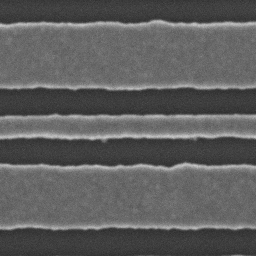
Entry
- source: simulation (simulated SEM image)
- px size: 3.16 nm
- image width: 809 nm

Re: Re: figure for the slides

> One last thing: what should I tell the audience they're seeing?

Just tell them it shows lines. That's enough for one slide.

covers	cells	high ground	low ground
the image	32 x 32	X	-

--------------------------------
--------------------------------
--------------------------------
XXXXXXXXXXXXXXXXXXXXXXXXXXXXXXXX
XXXXXXXXXXXXXXXXXXXXXXXXXXXXXXXX
XXXXXXXXXXXXXXXXXXXXXXXXXXXXXXXX
XXXXXXXXXXXXXXXXXXXXXXXXXXXXXXXX
XXXXXXXXXXXXXXXXXXXXXXXXXXXXXXXX
XXXXXXXXXXXXXXXXXXXXXXXXXXXXXXXX
XXXXXXXXXXXXXXXXXXXXXXXXXXXXXXXX
XXXXXXXXXXXXXXXXXXXXXXXXXXXXXXXX
--------------------------------
--------------------------------
--------------------------------
------XXXXX-X--XX-XXXXXXXXXXXXXX
XXXXXXXXXXXXXXXXXXXXXXXXXXXXXXXX
XXXXXXXXXXXXXXXXXXXXXXXXXXXXXXXX
--------------------------------
--------------------------------
--------------------------------
-----------------------X--------
XXXXXXXXXXXXXXXXXXXXXXXXXXXXXXXX
XXXXXXXXXXXXXXXXXXXXXXXXXXXXXXXX
XXXXXXXXXXXXXXXXXXXXXXXXXXXXXXXX
XXXXXXXXXXXXXXXXXXXXXXXXXXXXXXXX
XXXXXXXXXXXXXXXXXXXXXXXXXXXXXXXX
XXXXXXXXXXXXXXXXXXXXXXXXXXXXXXXX
XXXXXXXXXXXXXXXXXXXXXXXXXXXXXXXX
XX---XXXXXXXX-----XXXXXXXX-XXXXX
--------------------------------
--------------------------------
--------------------------------